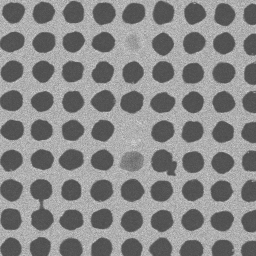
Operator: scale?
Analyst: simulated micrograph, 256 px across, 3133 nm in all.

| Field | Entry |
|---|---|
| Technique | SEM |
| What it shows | a regular array of holes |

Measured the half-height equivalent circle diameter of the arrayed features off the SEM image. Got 263 nanometres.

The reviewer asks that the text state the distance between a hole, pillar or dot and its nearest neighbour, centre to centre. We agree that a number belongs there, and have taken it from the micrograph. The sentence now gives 356 nanometres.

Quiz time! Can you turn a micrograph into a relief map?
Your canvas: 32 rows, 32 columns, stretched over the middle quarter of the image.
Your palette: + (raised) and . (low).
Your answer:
.....+++....+++....++++....+++..
.....++......++.....++.....+++..
.....++.....+++.....++......++..
....+++.....+++....+++.....+++..
++.+++++...+++++..++++++.+++++..
++++++++++++++++++++++++++++++++
++++++++++.+++++++++++++++++++++
....++++....++++...+++++..+++++.
.....++......++.....++......++..
.....++......+......++......++..
.....++......+......++......++..
....++++....+++....++++....+++..
++++++++++++++++++++++++++++++++
++++++++++++++++++++++++++++++++
+...++++....++++++++++++..+++++.
.....++.....+++++++++++....+++..
.....++.....++++++++++.....+++..
.....++.....++++++++++.....++...
....+++....++++++++++++....+++..
+++++++++++++++++++++++++++++++.
++++++++++++++++++++++++++++++++
+..++++++.++++++++++++++.+++++++
.....++.....+++++++++++....+++..
.....++.....++++++++++.....+++..
.....++.....++++++++++......++..
....+++.....++++++++++......++..
++++++++++++++++++++++......+++.
++++++++++++++++++++++++++..++++
++++++++++++++++++++++++++++++++
...+++++....+++....++++...+++++.
....+++.....+++....+++.....+++..
....+++.....++......++.....+++..